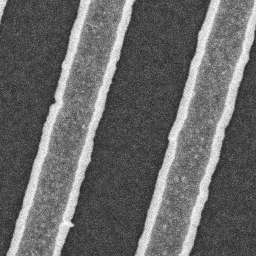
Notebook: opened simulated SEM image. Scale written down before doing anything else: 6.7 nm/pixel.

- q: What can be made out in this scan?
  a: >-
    one or a few lines or trenches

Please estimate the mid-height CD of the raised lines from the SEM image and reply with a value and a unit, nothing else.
45 px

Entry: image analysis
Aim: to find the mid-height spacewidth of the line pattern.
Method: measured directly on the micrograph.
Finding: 526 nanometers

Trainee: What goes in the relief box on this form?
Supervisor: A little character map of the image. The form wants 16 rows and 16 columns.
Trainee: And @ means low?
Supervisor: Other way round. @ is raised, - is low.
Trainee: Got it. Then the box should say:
-----@@@-----@@@
-----@@@-----@@@
-----@@@-----@@@
----@@@-----@@@-
----@@@-----@@@-
----@@@-----@@@-
----@@------@@--
---@@@-----@@@--
---@@@-----@@@--
---@@@-----@@@--
--@@@-----@@@---
--@@@-----@@@---
--@@@-----@@@---
-@@@-----@@@----
-@@@-----@@@----
-@@@-----@@@----